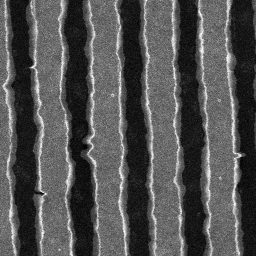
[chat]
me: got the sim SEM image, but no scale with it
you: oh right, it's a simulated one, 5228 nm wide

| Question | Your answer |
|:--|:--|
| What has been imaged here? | parallel lines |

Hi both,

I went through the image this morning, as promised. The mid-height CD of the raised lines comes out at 621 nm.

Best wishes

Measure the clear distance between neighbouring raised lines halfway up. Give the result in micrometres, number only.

0.513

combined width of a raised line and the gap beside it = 1140 nm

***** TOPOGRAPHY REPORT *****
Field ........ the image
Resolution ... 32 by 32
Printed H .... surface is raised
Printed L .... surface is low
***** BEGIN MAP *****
HLLLHHHHLLLHHHHLLLHHHHLLLHHHHLLL
HLLLHHHHLLLHHHHLLLHHHHLLLHHHHLLL
HLLLHHHHLLLHHHHLLLHHHHLLLHHHHLLL
HLLLHHHHLLLHHHHLLLHHHHLLLHHHLLLL
HLLLHHHHLLLHHHHLLLHHHHLLLHHHLLLL
HLLLHHHHLLLHHHHLLLHHHHLLLHHHLLLL
HLLLHHHHLLLHHHHLLLHHHHLLLHHHHLLL
HLLLHHHHLLLHHHHLLLHHHHLLLHHHHLLL
HLLLHHHHLLLHHHHLLLHHHHLLLHHHHLLL
HLLLHHHHLLLHHHHLLLHHHHLLLHHHHLLL
HLLLHHHHLLLHHHHLLLHHHHLLLHHHHLLL
HLLLHHHHLLLHHHHLLLHHHHLLLHHHHLLL
HLLLLHHHLLLHHHHLLLHHHHLLLHHHHLLL
HLLLLHHHLLLHHHHLLLHHHHLLLHHHHLLL
HHLLLHHHLLLHHHHLLLHHHHLLLLHHHLLL
HHLLLHHHHLLHHHHLLLLHHHLLLLHHHLLL
HHLLLHHHHLLHHHHLLLLHHHLLLLHHHLLL
HLLLLHHHHLLHHHHLLLLHHHLLLLHHHLLL
HHLLLHHHLLLHHHHHLLLHHHLLLLHHHHLL
HLLLLHHHHLLHHHHHLLLHHHLLLLHHHHLL
HLLLLHHHHLLHHHHLLLLHHHHLLLHHHHLL
HLLLLHHHHLLLHHHLLLLHHHLLLLHHHHLL
HLLLLHHHHLLLHHHHLLLHHHLLLLHHHHLL
HLLLLHHHHLLLHHHLLLLHHHLLLLHHHHLL
HHLLLHHHLLLLHHHLLLLHHHHLLLHHHHLL
HHLLLHHHHLLLHHHLLLLHHHHLLLHHHHLL
HHLLLHHHHLLLHHHLLLLHHHHLLLHHHHLL
HHLLLHHHHLLLHHHHLLLHHHHLLLHHHHLL
HHLLLHHHHLLLHHHHLLLHHHHLLLHHHHLL
HHLLLHHHHLLLHHHHLLLHHHHLLLHHHHLL
HHLLLHHHHLLLHHHHLLLHHHHLLLHHHHLL
HHLLLHHHHLLLHHHHLLLHHHHLLLHHHHLL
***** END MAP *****